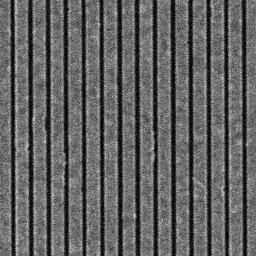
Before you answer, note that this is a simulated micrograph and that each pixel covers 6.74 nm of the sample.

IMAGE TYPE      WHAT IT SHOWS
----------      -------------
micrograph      parallel lines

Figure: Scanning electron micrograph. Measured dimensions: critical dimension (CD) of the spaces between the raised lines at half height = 40.4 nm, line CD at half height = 80.9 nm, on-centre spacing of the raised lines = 120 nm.